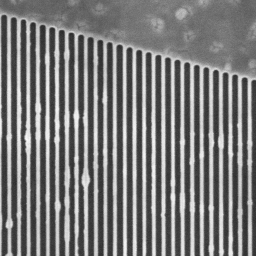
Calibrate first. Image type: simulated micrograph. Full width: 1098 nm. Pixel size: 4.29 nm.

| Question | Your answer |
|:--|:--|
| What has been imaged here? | parallel lines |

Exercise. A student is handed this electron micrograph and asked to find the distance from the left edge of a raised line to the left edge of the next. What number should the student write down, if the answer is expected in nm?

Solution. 41.3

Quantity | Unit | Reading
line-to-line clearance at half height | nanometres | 26.8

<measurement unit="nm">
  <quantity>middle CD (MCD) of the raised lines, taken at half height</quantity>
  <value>15.5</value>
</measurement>